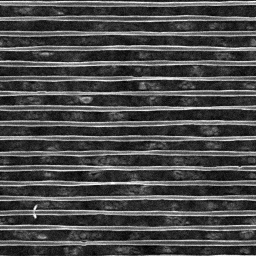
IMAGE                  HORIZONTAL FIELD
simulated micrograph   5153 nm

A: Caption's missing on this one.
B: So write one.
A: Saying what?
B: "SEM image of parallel lines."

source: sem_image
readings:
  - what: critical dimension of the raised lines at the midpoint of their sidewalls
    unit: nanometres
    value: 88.1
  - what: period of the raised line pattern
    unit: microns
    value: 0.301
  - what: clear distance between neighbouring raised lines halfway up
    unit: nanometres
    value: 211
